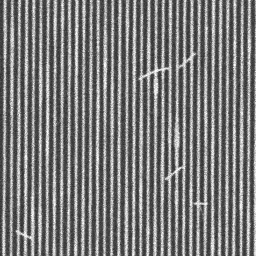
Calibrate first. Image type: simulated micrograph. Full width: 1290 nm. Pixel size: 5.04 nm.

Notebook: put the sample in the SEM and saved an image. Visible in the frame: parallel lines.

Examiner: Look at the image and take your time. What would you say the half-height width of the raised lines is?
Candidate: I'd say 0.017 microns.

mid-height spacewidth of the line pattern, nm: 21.4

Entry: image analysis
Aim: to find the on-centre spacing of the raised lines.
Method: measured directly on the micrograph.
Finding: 36.2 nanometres